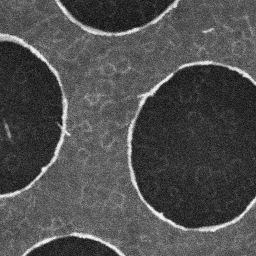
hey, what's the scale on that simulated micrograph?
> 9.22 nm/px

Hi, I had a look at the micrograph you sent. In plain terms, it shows holes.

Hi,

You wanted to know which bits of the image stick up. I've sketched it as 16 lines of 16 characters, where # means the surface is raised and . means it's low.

####.......#####
#####....#######
.###############
..##############
...########....#
....######......
....#####.......
....####........
....####........
...#####........
...#####........
..#######.......
#########.......
##########.....#
################
##.....#########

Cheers